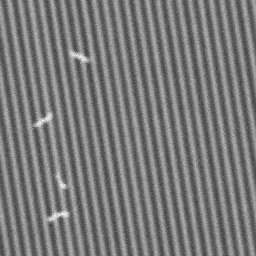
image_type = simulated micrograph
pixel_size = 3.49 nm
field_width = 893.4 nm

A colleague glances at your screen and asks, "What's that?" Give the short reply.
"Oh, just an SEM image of parallel lines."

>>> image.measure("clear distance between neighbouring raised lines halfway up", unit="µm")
0.0219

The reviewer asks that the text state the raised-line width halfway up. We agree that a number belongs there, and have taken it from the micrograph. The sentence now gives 15.9 nm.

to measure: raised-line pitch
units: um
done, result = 0.0367